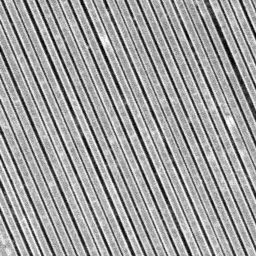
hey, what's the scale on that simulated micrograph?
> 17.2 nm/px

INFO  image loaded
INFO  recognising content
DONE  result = parallel lines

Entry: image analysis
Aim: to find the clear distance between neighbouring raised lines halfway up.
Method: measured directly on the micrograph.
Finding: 69.2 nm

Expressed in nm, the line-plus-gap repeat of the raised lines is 179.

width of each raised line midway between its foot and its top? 113 nm